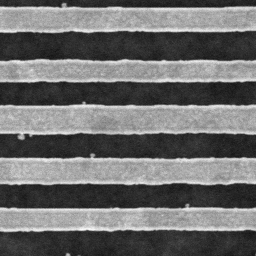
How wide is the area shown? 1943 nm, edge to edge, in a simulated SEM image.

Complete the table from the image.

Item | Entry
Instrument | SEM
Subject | lines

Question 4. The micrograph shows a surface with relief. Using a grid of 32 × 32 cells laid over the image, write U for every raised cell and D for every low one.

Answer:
DDDDDDDDDDDDDDDDDDDDDDDDDDDDDDDD
UUUUUUUUUUUUUUUUUUUUUUUUUUUUUUUU
UUUUUUUUUUUUUUUUUUUUUUUUUUUUUUUU
UUUUUUUUUUUUUUUUUUUUUUUUUUUUUUUU
DDDDDDDDDDDDDDDDDDDDDDDDDDDDDDDD
DDDDDDDDDDDDDDDDDDDDDDDDDDDDDDDD
DDDDDDDDDDDDDDDDDDDDDDDDDDDDDDDD
DDDDDDDDUDDDDDDDDDDDDDDDDDDDDDDD
UUUUUUUUUUUUUUUUUUUUUUUUUUUUUUUU
UUUUUUUUUUUUUUUUUUUUUUUUUUUUUUUU
DDDDDDDDDDDDDDDDDDDDDDDDDDDDDDDD
DDDDDDDDDDDDDDDDDDDDDDDDDDDDDDDD
DDDDDDDDDDDDDDDDDDDDDDDDDDDDDDDD
UUUUUUUUUUUUUUUUUUUUUUUUUUUUUUUU
UUUUUUUUUUUUUUUUUUUUUUUUUUUUUUUU
UUUUUUUUUUUUUUUUUUUUUUUUUUUUUUUU
UUUUUUUUUUUUUUUUUUUUUUUUUUUUUUUU
DDDDDDDDDDDDDDDDDDDDDDDDDDDDDDDD
DDDDDDDDDDDDDDDDDDDDDDDDDDDDDDDD
DDDDDDDDDDDDDDDDDDDDDDDDDDDDDDDD
UUUUUUUUUUUUUUUUUUUUUUUUUUUUUUUU
UUUUUUUUUUUUUUUUUUUUUUUUUUUUUUUU
UUUUUUUUUUUUUUUUUUUUUUUUUUUUUUUU
DDDDDDDDDDDDDDDDDDDDDDDDDDDDDDDD
DDDDDDDDDDDDDDDDDDDDDDDDDDDDDDDD
DDDDDDDDDDDDDDDDDDDDDDDDDDDDDDDD
UUUUUUUUUUUUUUUUUUUUUUUUUUUUUUUU
UUUUUUUUUUUUUUUUUUUUUUUUUUUUUUUU
UUUUUUUUUUUUUUUUUUUUUUUUUUUUUUUU
DDDDDDDDDDDDDDDDDDDDDDDDDDDDDDDD
DDDDDDDDDDDDDDDDDDDDDDDDDDDDDDDD
DDDDDDDDDDDDDDDDDDDDDDDDDDDDDDDD